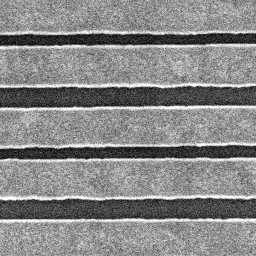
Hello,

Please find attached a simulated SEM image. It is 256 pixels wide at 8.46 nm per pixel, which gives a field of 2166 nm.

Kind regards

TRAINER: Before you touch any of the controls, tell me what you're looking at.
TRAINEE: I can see lines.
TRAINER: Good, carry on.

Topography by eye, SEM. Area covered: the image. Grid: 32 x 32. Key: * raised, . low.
********************************
********************************
********************************
********************************
................................
................................
********************************
********************************
********************************
********************************
********************************
................................
................................
............****.***************
********************************
********************************
********************************
********************************
................................
................................
********************************
********************************
********************************
********************************
********************************
................................
................................
................................
********************************
********************************
********************************
********************************